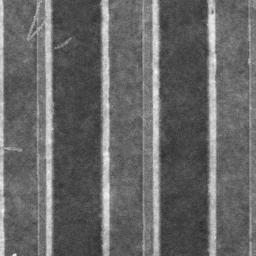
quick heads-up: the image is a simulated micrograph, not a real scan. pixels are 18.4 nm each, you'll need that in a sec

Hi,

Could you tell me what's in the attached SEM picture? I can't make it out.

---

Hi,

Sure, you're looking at lines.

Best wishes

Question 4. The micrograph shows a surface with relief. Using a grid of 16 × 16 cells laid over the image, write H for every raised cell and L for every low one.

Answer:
HHHLLLLHHHLLLHHH
HHHLLLLHHHLLLHHH
HHHLLLLHHHLLLHHH
HHHLLLLHHHLLLHHH
HHHLLLLHHHLLLHHH
HHHLLLLHHHLLLHHH
HHHLLLLHHHLLLHHH
HHHLLLLHHHLLLHHH
HHHLLLLHHHLLLHHH
HHHLLLLHHHLLLHHH
HHHLLLLHHHLLLHHH
HHHLLLLHHHLLLHHH
HHHLLLLHHHLLLHHH
HHHLLLLHHHLLLHHH
HHHLLLLHHHLLLHHH
HHHLLLLHHHLLLHHH